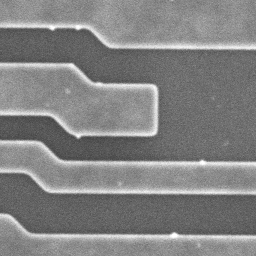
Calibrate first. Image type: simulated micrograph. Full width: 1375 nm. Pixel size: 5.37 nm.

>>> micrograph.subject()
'groups of lines, slits or small figures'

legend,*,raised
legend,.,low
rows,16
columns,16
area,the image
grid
****************
****************
......**********
................
*****...........
**********......
**********......
...*******......
................
***.............
****************
..**************
................
*...............
**..............
****************